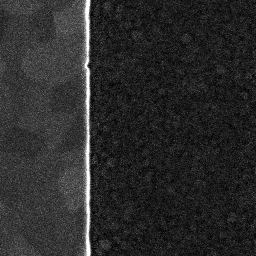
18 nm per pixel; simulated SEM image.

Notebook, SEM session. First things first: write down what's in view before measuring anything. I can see one or a few lines or trenches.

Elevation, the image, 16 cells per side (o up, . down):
oooooo..........
oooooo..........
oooooo..........
oooooo..........
oooooo..........
oooooo..........
oooooo..........
oooooo..........
oooooo..........
oooooo..........
oooooo..........
oooooo..........
oooooo..........
oooooo..........
oooooo..........
oooooo..........